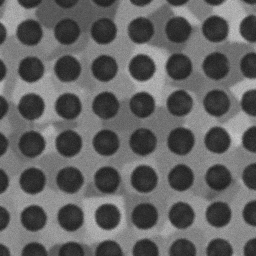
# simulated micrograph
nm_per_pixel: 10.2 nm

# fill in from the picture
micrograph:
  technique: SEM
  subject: a regular array of holes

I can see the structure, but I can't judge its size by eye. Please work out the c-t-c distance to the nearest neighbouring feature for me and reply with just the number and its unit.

0.376 micrometres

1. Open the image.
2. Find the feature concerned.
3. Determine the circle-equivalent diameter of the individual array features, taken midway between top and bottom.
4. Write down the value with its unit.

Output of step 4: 27.9 pixels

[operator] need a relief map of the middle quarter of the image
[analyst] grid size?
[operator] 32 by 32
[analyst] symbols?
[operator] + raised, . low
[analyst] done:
....+++.......++.......++.......
.....++.......++.......++.......
....+++......+++.......+++......
...+++++.....++++.....+++++....+
..+++++++..++++++++.++++++++++++
++++++++++++++++++++++++++++++++
++++++++++++++++++++++++++++..++
...+++++.....+++++....+++++....+
....+++......+++.......+++......
....+++.......++.......+++......
.....++.......++.......+++......
....+++.......++.......+++......
....++++.....++++.....+++++....+
...++++++...+++++++..+++++++++++
++++++++++++++++++++++++++++++++
++++++++++++++++++++++++++++++++
..+++++++...++++++....+++++.....
....++++.....++++......+++......
....+++.......++.......+++......
.....++.......++.......++.......
.....++.......++.......+++......
....+++.......+++......+++......
....+++++....+++++....+++++....+
++++++++++++++++++++++++++++++++
++++++++++++++++++++++++++++++++
++++++++++..++++++....+++++....+
....++++.....++++......++++.....
.....+++......+++......+++......
.....++.......+++.......++......
.....++.......+++......+++......
.....+++......+++......+++......
....++++.....+++++....+++++....+